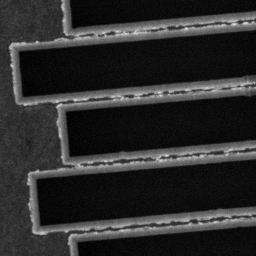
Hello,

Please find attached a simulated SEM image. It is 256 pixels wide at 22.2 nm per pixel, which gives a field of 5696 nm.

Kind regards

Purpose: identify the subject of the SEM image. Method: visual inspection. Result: one or a few lines or trenches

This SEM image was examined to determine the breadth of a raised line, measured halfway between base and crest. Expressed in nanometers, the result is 260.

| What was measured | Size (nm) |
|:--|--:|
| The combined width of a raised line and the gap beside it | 1440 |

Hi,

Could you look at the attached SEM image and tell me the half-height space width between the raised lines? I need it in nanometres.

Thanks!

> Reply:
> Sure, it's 1200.